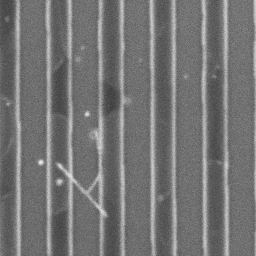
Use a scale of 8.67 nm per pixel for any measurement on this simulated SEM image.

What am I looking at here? wiring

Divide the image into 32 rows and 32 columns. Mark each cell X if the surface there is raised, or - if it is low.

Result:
XX----XXX----XX----XXX---XXX----
XX----XXX----XX----XXX----XX----
XX----XXX----XX----XXX----XX----
XX----XXX----XX----XXX----XX----
XX----XXX----XX----XXX----XX----
XX----XXX----XX----XXX----XX----
XX----XXX----XX----XXX----XX----
XX----XXX----XX----XXX----XX----
XX----XXX----XX----XXX----XX----
XX----XXX----XX----XXX----XX----
XX----XXX----XX----XXX----XX----
XX----XXX----XX----XXX----XX----
XX----XXX----XX----XXX----XX----
XX----XXX----XX----XXX----XX----
XX----XXX----XX----XXX----XX----
XX----XXX----XX----XXX----XX----
XX----XXX----XX----XXX----XX----
XX----XXX----XX----XXX----XX----
XX----XXX----XX----XXX----XX----
XX----XXX---XXX----XXX----XX----
XX----XXX----XX----XXX----XX----
XX----XXX---XXX----XXX----XX----
XX----XXX----XX----XXX----XX----
XX----XXX----XX----XXX----XX----
XX----XXX----XX----XXX----XX----
XX----XXX----XX----XXX----XX----
XX----XXX----XX----XXX----XX----
XX----XXX----XX----XXX----XX----
XX----XXX----XX----XXX----XX----
XX----XXX----XX----XXX----XX----
XX----XXX----XX----XXX----XX----
XX----XXX----XX----XXX----XX----